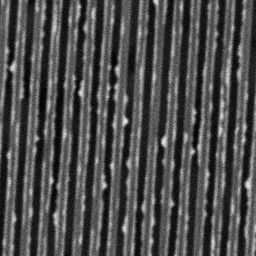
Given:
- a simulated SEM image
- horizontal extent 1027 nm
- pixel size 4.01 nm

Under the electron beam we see parallel lines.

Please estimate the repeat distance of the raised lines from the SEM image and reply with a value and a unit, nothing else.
0.0693 micrometres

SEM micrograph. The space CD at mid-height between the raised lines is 0.031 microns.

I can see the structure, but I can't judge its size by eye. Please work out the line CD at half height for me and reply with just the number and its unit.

9.48 px